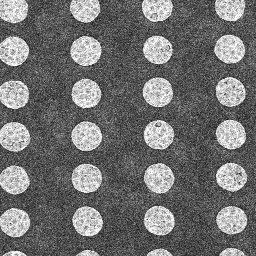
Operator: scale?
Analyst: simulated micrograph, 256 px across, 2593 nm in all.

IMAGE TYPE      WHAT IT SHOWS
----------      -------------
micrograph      a regular array of raised bodies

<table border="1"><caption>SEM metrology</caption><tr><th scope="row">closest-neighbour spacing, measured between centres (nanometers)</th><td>430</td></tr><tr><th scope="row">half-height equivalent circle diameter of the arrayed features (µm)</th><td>0.287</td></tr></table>